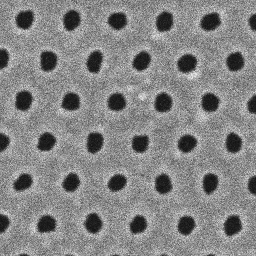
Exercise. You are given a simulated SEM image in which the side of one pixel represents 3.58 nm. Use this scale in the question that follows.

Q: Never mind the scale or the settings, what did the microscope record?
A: a regular array of holes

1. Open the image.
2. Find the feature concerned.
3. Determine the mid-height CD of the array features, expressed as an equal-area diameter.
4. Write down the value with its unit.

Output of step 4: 67.3 nanometres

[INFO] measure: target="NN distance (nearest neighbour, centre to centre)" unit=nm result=164